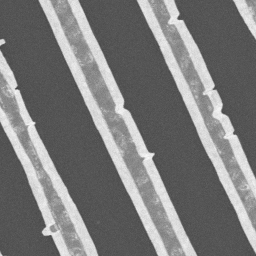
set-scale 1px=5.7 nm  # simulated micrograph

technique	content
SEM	one or a few lines or trenches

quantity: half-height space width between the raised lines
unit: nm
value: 360